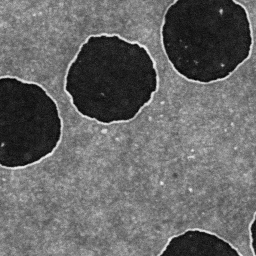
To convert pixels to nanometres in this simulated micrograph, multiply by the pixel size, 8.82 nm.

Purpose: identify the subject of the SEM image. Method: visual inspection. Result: holes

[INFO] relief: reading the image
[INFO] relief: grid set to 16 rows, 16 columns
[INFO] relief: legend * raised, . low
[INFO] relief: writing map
***********....*
**********......
******..**......
*****....*.....*
****......*...**
...*......******
...**....*******
....**..********
....************
...*************
****************
****************
****************
****************
************.***
**********.....*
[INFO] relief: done